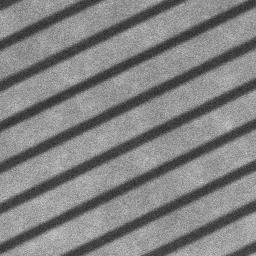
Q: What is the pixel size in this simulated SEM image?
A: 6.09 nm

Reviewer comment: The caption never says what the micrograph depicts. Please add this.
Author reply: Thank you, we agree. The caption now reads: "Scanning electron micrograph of parallel lines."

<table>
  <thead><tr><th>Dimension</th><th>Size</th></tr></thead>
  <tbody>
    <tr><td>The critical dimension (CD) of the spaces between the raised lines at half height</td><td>9.98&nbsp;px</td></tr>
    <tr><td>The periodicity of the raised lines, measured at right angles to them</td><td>223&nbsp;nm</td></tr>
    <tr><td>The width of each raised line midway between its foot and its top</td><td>158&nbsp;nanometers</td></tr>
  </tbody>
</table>